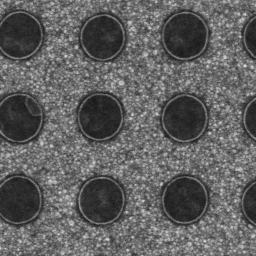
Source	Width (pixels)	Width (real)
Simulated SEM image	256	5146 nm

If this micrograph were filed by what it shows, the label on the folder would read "raised bodies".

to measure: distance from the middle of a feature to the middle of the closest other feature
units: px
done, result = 81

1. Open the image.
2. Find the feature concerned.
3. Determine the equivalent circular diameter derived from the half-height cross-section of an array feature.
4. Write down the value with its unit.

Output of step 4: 0.909 microns